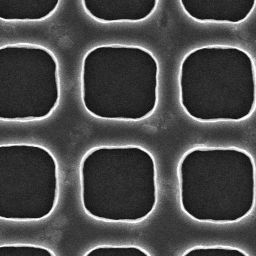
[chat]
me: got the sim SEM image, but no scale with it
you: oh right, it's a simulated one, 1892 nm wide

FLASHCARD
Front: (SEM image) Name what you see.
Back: holes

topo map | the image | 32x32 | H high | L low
LLLLLLLHHHHLLLLLLLLHHHHLLLLLLLLL
LLLLLLLHHHHLLLLLLLLHHHHLLLLLLLLH
HHHLHHHHHHHHHLLLLHHHHHHHHLLLLLHH
HHHHHHHHHHHHHHHHHHHHHHHHHHHHHHHH
HHHHHHHHHHHHHHHHHHHHHHHHHHHHHHHH
HHHHHHHHHHHHHHHHHHHHHHHHHHHHHHHH
LLLLLLHHHHHLLLLLLLHHHHHHLLLLLLLH
LLLLLLLHHHHLLLLLLLLHHHHLLLLLLLLH
LLLLLLLHHHLLLLLLLLLLHHHLLLLLLLLL
LLLLLLLHHHLLLLLLLLLLHHHLLLLLLLLL
LLLLLLLHHHLLLLLLLLLLHHHLLLLLLLLL
LLLLLLLHHHLLLLLLLLLHHHHLLLLLLLLL
LLLLLLLHHHHLLLLLLLLHHHHLLLLLLLLL
LLLLLLLHHHHLLLLLLLLHHHHLLLLLLLLL
LLLLLLHHHHHHLLLLLLHHHHHHLLLLLLLH
HHHHHHHHHHHHHHHHHHHHHHHHHHHHHHHH
HHHHHHHHHHHHHHHHHHHHHHHHHHHHHHHH
HHHHHHHHHHHHHHHHHHHHHHHHHHHHHHHH
LLLLLHHHHHHHLLLLLHHHHHHHHHHHHHHH
LLLLLLHHHHHLLLLLLLLHHHHLLLLLLLLH
LLLLLLLHHHLLLLLLLLLHHHHLLLLLLLLL
LLLLLLLHHHLLLLLLLLLHHHLLLLLLLLLL
LLLLLLLHHHLLLLLLLLLHHHHLLLLLLLLL
LLLLLLLHHHLLLLLLLLLHHHHLLLLLLLLL
LLLLLLLHHHLLLLLLLLLHHHHLLLLLLLLL
LLLLLLLHHHLLLLLLLLLHHHHLLLLLLLLL
LLLLLLHHHHHLLLLLLLLHHHHLLLLLLLLH
HHHHHHHHHHHHHHLLLHHHHHHHHLLLLLHH
HHHHHHHHHHHHHHHHHHHHHHHHHHHHHHHH
HHHHHHHHHHHHHHHHHHHHHHHHHHHHHHHH
HHHHHHHHHHHHHHHHHHHHHHHHHHHHHHHH
LLLLLLHHHHHLLLLLLLHHHHHHLLLLLLHH